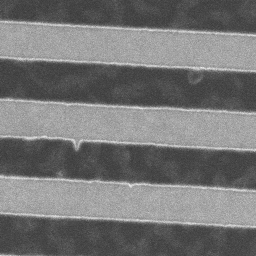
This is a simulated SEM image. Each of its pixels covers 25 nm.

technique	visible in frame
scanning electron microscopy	one or a few lines or trenches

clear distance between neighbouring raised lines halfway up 0.87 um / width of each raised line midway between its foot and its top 1060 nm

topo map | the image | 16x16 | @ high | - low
@@@@@@@@@@@@@@@@
---@@@@@@@@@@@@@
----------------
----------------
@@@@@@@@@@@@@@@@
@@@@@@@@@@@@@@@@
----@@@@@@@@@@@@
----------------
----------------
@@@@@@@@@@@@@@@@
@@@@@@@@@@@@@@@@
--------@@@@@@@@
----------------
@@@@------------
@@@@@@@@@@@@@@@@
@@@@@@@@@@@@@@@@